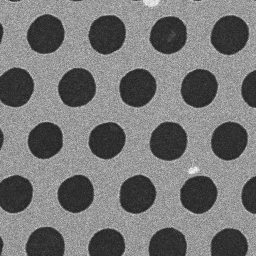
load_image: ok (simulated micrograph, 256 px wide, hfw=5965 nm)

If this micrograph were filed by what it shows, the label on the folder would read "a regular array of holes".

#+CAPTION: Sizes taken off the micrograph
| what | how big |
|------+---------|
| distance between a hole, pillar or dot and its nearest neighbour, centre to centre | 1.42 micrometres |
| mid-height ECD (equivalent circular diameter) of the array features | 889 nanometers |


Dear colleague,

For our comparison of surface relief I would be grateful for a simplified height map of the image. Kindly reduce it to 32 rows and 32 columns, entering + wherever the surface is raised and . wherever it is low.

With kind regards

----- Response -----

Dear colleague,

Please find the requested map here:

++++++++++++++++++++++++++++++++
++++++++++++++++++++++++++++++++
++++...+++++...+++++...++++...++
++++....+++.....+++....++++....+
+++.....+++.....+++....+++.....+
++++....+++....++++....+++.....+
+++++..+++++..++++++..+++++...++
++++++++++++++++++++++++++++++++
+..++++++.++++++++++++++++++++++
....++++....++++...++++....++++.
....+++.....+++.....+++....+++..
....+++.....+++.....+++....+++..
....++++...++++....++++....++++.
++++++++++++++++++++++++++++++++
++++++++++++++++++++++++++++++++
+++++..++++++..+++++..++++++..++
++++....+++.....+++....++++....+
+++.....+++.....+++....+++.....+
++++....+++....++++....+++.....+
++++...+++++..+++++....++++...++
++++++++++++++++++++++++++++++++
++++++++++++++++++++++++++++++++
....++++...+++++...++++...+++++.
....+++.....+++....++++....+++..
....+++.....+++....+++.....+++..
....+++....++++....++++....+++..
+.+++++++.++++++..++++++..+++++.
++++++++++++++++++++++++++++++++
+++++..++++++++++++++.++++++++++
++++....++++...++++....++++....+
+++.....+++.....+++....+++.....+
+++.....+++....++++....+++.....+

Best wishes